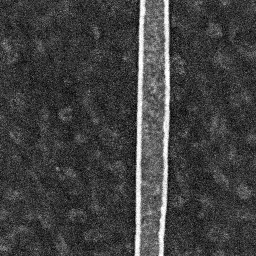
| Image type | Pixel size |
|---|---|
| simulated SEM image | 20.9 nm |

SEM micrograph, one or a few lines or trenches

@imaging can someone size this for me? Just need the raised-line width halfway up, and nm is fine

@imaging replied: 566